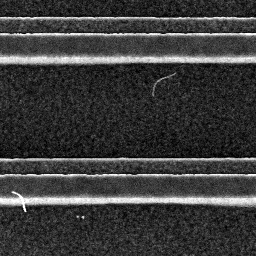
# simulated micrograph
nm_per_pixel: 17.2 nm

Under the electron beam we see lines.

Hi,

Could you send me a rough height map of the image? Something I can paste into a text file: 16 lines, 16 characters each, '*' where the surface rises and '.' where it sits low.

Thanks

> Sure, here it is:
................
****************
****************
****************
................
................
................
................
................
................
****************
****************
.*..............
................
................
................